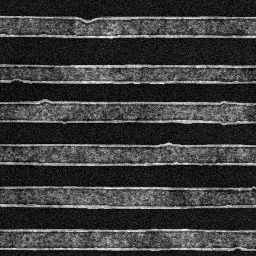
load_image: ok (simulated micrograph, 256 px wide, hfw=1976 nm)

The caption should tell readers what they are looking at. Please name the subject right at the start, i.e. parallel lines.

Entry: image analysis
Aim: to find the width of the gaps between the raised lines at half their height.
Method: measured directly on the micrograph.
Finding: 0.176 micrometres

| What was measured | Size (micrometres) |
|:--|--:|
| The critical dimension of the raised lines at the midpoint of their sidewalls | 0.149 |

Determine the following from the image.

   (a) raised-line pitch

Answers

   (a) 328 nanometers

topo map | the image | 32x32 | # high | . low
................................
................................
###########.####################
################################
################################
................................
................................
................................
################################
################################
................................
................................
................................
################################
################################
............................#...
................................
................................
################################
################################
.....################.....######
................................
................................
.###################............
################################
################################
................................
................................
................................
################################
################################
................................